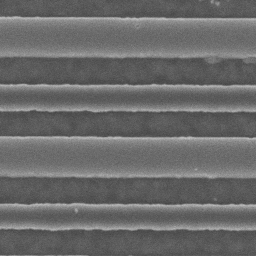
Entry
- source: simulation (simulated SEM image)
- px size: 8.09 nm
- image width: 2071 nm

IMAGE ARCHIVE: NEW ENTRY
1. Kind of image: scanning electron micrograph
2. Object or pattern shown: lines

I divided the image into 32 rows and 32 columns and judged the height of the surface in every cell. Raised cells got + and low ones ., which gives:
................................
................................
++++++++++++++++++++++++++++++++
++++++++++++++++++++++++++++++++
++++++++++++++++++++++++++++++++
++++++++++++++++++++++++++++++++
++++++++++++++++++++++++++++++++
................................
................................
................................
................................
++++++++++++++++++++++++++++++++
++++++++++++++++++++++++++++++++
++++++++++++++++++++++++++++++++
................................
................................
................................
++++++++++++++++++++++++++++++++
++++++++++++++++++++++++++++++++
++++++++++++++++++++++++++++++++
++++++++++++++++++++++++++++++++
++++++++++++++++++++++++++++++++
................................
................................
................................
....++...+......................
++++++++++++++++++++++++++++++++
++++++++++++++++++++++++++++++++
+.+.++++++++++++++++++++++++++++
................................
................................
................................